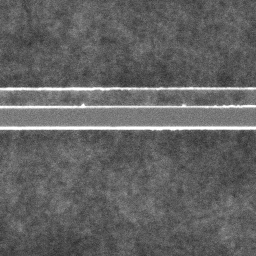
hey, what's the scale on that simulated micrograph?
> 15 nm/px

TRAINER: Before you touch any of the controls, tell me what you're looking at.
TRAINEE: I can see lines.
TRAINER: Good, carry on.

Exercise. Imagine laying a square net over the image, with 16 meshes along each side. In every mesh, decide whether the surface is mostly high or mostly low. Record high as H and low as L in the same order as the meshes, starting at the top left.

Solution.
LLLLLLLLLLLLLLLL
LLLLLLLLLLLLLLLL
LLLLLLLLLLLLLLLL
LLLLLLLLLLLLLLLL
LLLLLLLLLLLLLLLL
LLLLLLLLLLLLLLLL
HHHHHHHHHHHHHHHH
HHHHHHHHHHHHHHHH
LLLLLLLLLLLLLLLL
LLLLLLLLLLLLLLLL
LLLLLLLLLLLLLLLL
LLLLLLLLLLLLLLLL
LLLLLLLLLLLLLLLL
LLLLLLLLLLLLLLLL
LLLLLLLLLLLLLLLL
LLLLLLLLLLLLLLLL